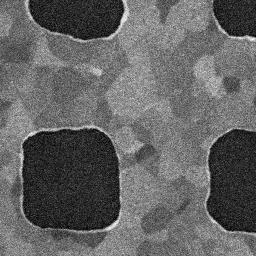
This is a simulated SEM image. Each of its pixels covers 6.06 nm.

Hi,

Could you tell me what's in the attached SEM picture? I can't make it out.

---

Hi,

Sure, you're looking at holes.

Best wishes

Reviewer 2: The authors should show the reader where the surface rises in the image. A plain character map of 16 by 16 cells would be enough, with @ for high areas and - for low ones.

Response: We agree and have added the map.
@@------@@@@@---
@@------@@@@@@--
@@@@@@@@@@@@@@@@
@@@@@@@@@@@@@@@@
@@@@@@@@@@@@@@@@
@@@@@@@@@@@@@@@@
@@@@@@@@@@@@@@@@
@@@@@@@@@@@@@@@@
@@-----@@@@@@@--
@------@@@@@@---
@------@@@@@@---
@------@@@@@@---
@-------@@@@@---
@@-----@@@@@@---
@@@@@-@@@@@@@@@-
@@@@@@@@@@@@@@@@